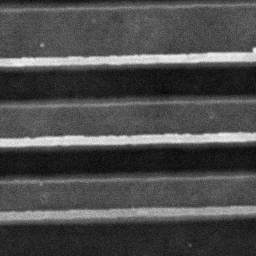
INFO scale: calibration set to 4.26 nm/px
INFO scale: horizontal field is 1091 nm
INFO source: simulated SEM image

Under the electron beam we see lines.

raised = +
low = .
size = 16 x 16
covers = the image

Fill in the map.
.+++++++++++++++
++++++++++++++++
++++++++++++++++
++++++++++++++++
................
................
....++++++++++++
++++++++++++++++
++++++++++++++++
................
................
++++++++++++++++
++++++++++++++++
++++++++++++....
................
................